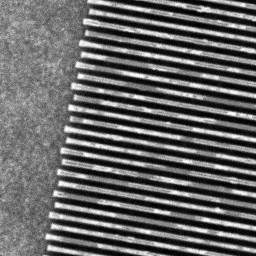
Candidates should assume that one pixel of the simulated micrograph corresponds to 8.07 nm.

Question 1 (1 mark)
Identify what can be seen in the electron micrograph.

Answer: parallel lines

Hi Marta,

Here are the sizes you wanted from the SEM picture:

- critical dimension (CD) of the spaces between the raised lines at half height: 6.16 pixels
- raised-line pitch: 88.1 nanometres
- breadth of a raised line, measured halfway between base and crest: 35.8 nm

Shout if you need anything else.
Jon